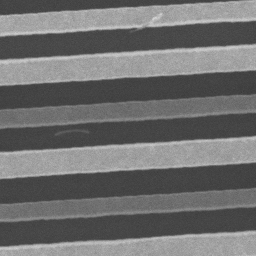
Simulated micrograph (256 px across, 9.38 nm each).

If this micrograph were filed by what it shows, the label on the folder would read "lines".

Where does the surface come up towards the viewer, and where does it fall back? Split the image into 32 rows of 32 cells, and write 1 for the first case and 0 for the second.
00000000000000000000000011111111
00000001111111111111111111111111
11111111111111111111111111111111
11111111111111111100000000000000
10000000000000000000000000000000
00000000000000000000000000000000
00000000000000000111111111111111
00111111111111111111111111111111
11111111111111111111111111111111
11111111111111111111000000000000
11110000000000000000000000000000
00000000000000000000000000000000
00000000000000000000001111111111
00000111111111111111111111111111
11111111111111111111111110000000
11111111100000000000000000000000
00000000000000000000000000000000
00000000000000000000000001111111
00000000011111111111111111111111
11111111111111111111111111111111
11111111111111111111111111111000
11111111111100000000000000000000
00000000000000000000000000000000
00000000000000000000000000000000
00000000000000000111111111111111
01111111111111111111111111111111
11111111111111111111100000000000
11110000000000000000000000000000
00000000000000000000000000000000
00000000000000000000001111111111
00000001111111111111111111111111
11111111111111111111111111111111